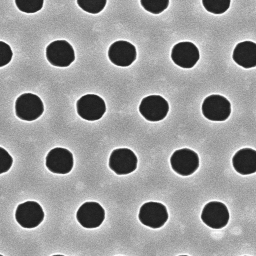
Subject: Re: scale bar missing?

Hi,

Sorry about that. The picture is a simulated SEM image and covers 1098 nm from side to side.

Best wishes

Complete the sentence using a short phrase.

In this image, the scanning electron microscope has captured a regular array of holes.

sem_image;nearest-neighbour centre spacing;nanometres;264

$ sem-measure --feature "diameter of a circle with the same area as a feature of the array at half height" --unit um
0.118